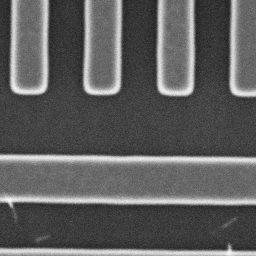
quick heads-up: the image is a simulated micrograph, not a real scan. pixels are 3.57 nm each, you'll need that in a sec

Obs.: groups of lines, slits or small figures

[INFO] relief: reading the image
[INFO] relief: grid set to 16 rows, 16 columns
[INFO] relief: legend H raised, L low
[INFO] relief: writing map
LHHLLHHHLLHHLLLH
LHHLLHHHLLHHLLLH
LHHLLHHLLLHHLLLH
LHHLLHHLLLHHLLLH
LHHLLHHLLLHHLLHH
LHHLLHHLLLHHLLLH
LLLLLLLLLLLLLLLL
LLLLLLLLLLLLLLLL
LLLLLLLLLLLLLLLL
LLLLLLLLLLLLLLLL
HHHHHHHHHHHHHHHH
HHHHHHHHHHHHHHHH
HHHHHHHHHHHHHHHH
LLLLLLLLLLLLLLLL
LLLLLLLLLLLLLLLL
LLLLLLLLLLLLLLLL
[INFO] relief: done